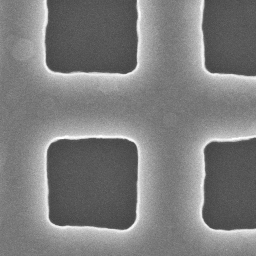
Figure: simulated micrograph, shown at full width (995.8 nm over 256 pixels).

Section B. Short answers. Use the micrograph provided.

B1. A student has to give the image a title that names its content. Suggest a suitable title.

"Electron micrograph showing holes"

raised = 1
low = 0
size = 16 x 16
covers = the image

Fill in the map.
1110000001111000
1110000001111000
1110000001111000
1110000001111000
1110000011111000
1111111111111111
1111111111111111
1111111111111111
1111111111111111
1110000001111000
1110000001111000
1110000001111000
1110000001111000
1110000011111000
1111111111111111
1111111111111111